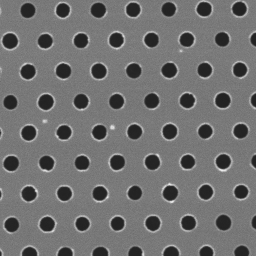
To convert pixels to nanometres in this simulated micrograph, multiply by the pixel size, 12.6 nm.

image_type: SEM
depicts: a regular array of holes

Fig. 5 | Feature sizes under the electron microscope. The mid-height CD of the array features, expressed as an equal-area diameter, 0.189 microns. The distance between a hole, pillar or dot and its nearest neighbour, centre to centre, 0.442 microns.